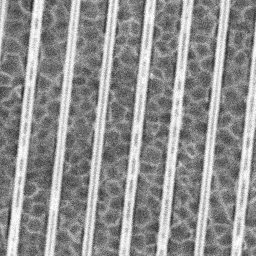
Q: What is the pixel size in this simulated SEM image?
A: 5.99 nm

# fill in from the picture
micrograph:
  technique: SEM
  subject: parallel lines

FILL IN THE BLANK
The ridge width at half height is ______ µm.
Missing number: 0.0454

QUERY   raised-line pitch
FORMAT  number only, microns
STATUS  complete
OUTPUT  0.223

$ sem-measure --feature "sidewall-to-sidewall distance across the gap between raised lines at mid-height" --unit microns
0.174